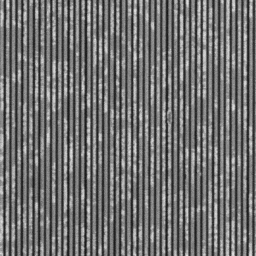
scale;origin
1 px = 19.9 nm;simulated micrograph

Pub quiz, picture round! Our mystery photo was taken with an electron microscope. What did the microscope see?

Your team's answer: parallel lines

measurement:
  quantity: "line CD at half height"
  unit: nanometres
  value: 54.7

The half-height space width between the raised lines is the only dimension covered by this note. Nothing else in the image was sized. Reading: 54.7 nm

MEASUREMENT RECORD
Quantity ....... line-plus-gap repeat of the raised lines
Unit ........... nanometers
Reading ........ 115